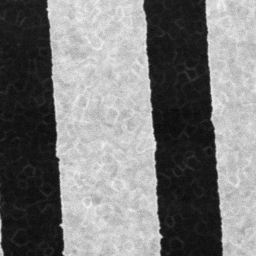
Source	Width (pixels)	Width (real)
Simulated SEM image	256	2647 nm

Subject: one or a few lines or trenches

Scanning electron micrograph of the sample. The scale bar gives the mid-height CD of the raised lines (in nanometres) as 983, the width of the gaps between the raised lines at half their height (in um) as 0.645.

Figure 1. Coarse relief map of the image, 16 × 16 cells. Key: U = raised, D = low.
DDDUUUUUUDDDDUUU
DDDUUUUUUDDDDUUU
DDDUUUUUUDDDDUUU
DDDUUUUUUDDDDUUU
DDDUUUUUUDDDDUUU
DDDUUUUUUDDDDUUU
DDDUUUUUUDDDDUUU
DDDDUUUUUDDDDUUU
DDDDUUUUUUDDDUUU
DDDDUUUUUUDDDDUU
DDDDUUUUUUDDDDUU
DDDDUUUUUUDDDDUU
DDDDUUUUUUDDDDUU
DDDDUUUUUUDDDDUU
DDDDUUUUUUDDDDUU
DDDDUUUUUUDDDDUU